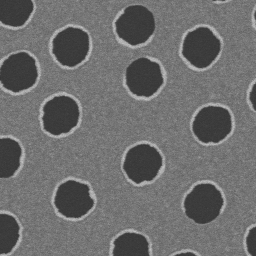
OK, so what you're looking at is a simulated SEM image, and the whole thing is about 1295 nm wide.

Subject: a regular array of holes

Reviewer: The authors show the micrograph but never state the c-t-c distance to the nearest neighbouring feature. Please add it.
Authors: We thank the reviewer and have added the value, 351 nm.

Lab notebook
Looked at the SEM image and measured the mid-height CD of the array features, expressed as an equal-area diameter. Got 192 nm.